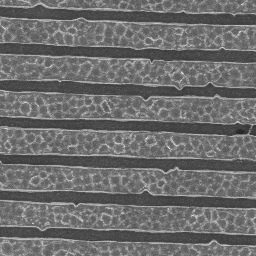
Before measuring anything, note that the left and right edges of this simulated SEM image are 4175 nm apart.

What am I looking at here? parallel lines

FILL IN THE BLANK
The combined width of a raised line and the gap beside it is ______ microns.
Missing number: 0.597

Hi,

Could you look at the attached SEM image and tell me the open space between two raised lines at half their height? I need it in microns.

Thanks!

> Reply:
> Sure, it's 0.181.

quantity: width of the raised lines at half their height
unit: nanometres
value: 405